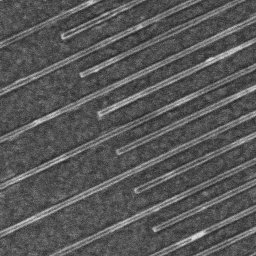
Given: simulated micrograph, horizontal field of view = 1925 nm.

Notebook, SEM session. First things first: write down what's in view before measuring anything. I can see parallel lines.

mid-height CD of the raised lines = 0.0297 microns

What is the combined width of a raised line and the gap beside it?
161 nm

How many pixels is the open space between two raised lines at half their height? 18.6